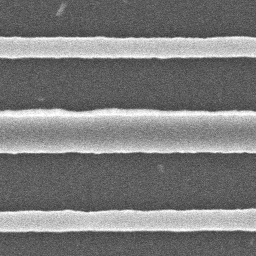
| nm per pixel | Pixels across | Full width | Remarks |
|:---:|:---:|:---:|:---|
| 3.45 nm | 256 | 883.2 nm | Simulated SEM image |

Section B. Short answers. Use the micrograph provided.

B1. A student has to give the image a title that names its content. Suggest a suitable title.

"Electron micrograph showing lines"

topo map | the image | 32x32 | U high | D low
DDDDDDDDDDDDDDDDDDDDDDDDDDDDDDDD
DDDDDDDDDDDDDDDDDDDDDDDDDDDDDDDD
DDDDDDDDDDDDDDDDDDDDDDDDDDDDDDDD
DDDDDDDDDDDDDDDDDDDDDDDDDDDDDDDD
DDDDDDDDDDDDDDDDDDDDDDDDDDDDDDDD
UUUUUUUUUUUUUUUUUUUUUUUUUUUUUUUU
UUUUUUUUUUUUUUUUUUUUUUUUUUUUUUUU
DDDDDDDDDDDDDDDDDDDDDDDDDDDDDDDD
DDDDDDDDDDDDDDDDDDDDDDDDDDDDDDDD
DDDDDDDDDDDDDDDDDDDDDDDDDDDDDDDD
DDDDDDDDDDDDDDDDDDDDDDDDDDDDDDDD
DDDDDDDDDDDDDDDDDDDDDDDDDDDDDDDD
DDDDDDDDDDDDDDDDDDDDDDDDDDDDDDDD
DDDDDDDDDDDDDDDDDDDDDDDDDDDDDDDD
UUUUUUUUUUUUUUUUUUUUUUUUUUUUUUUU
UUUUUUUUUUUUUUUUUUUUUUUUUUUUUUUU
UUUUUUUUUUUUUUUUUUUUUUUUUUUUUUUU
UUUUUUUUUUUUUUUUUUUUUUUUUUUUUUUU
UUUUUUUUUUUUUUUUUUUUUUUUUUUUUUUU
DDDDDDDDDDDDDDDDDDDDDDDDDDDDDDDD
DDDDDDDDDDDDDDDDDDDDDDDDDDDDDDDD
DDDDDDDDDDDDDDDDDDDDDDDDDDDDDDDD
DDDDDDDDDDDDDDDDDDDDDDDDDDDDDDDD
DDDDDDDDDDDDDDDDDDDDDDDDDDDDDDDD
DDDDDDDDDDDDDDDDDDDDDDDDDDDDDDDD
DDDDDDDDDDDDDDDDDDDDDDDDDDDDDDDD
DDDUUUUUUUDDDUUUUUDUUUUUUUUUUUUU
UUUUUUUUUUUUUUUUUUUUUUUUUUUUUUUU
UUUUUUUUUUUUUUUUUUUUUUUUUUUUUUUU
DDDDDDDDDDDDDDDDDDDDDDDDDDDDDDDD
DDDDDDDDDDDDDDDDDDDDDDDDDDDDDDDD
DDDDDDDDDDDDDDDDDDDDDDDDDDDDDDDD